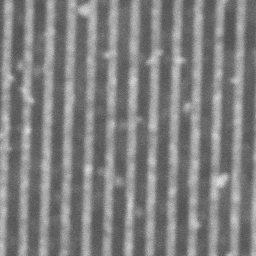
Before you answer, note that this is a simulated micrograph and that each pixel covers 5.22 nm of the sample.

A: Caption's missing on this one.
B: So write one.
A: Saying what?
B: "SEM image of parallel lines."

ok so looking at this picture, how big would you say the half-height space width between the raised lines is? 0.0783 µm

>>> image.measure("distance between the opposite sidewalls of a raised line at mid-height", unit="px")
5.63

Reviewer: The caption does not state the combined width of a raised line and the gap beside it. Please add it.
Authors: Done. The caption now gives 0.11 microns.